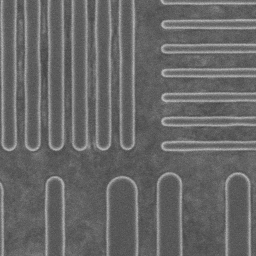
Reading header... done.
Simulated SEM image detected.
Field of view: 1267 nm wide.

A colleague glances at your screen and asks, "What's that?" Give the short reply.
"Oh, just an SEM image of groups of lines, slits or small figures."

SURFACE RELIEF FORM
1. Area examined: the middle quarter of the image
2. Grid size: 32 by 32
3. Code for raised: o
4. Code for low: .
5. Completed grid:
..oooo..ooo...ooo...............
..oooo..oooo..ooo........ooooooo
..oooo..oooo..ooo.......oooooooo
..oooo..oooo..ooo...............
..oooo..oooo..ooo...............
..oooo..ooo...ooo...............
..oooo..ooo...ooo...............
..oooo..oooo..ooo........ooooooo
..oooo..oooo..oooo......oooooooo
..oooo..oooo..oooo..............
..oooo..oooo..oooo..............
..oooo..oooo..oooo..............
..oooo..oooo..oooo..............
..oooo..oooo..oooo.......ooooooo
..oooo..oooo..oooo......oooooooo
..oooo..oooo..oooo..............
..oooo..oooo..oooo..............
..oooo..oooo..oooo..............
..oooo..oooo..oooo..............
..oooo..oooo..oooo..........ooo.
..oooo..ooo...ooo.......oooooooo
...oo....................ooooooo
................................
................................
................................
................................
................................
.........................ooo....
.............ooo........ooooo...
............ooooo.......ooooo...
...........ooooooo.....oooooo...
...........ooooooo.....oooooo...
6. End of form